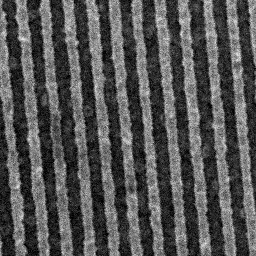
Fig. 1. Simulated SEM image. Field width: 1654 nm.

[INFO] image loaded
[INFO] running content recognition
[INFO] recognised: parallel lines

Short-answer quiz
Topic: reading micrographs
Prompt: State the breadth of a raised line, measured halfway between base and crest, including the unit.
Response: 57.1 nanometers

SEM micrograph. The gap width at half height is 88.9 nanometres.